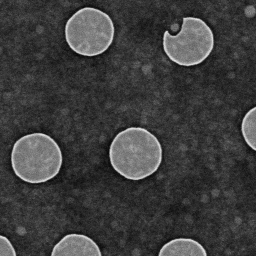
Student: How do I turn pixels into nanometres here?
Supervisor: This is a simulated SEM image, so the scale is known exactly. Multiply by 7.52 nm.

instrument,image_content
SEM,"raised bodies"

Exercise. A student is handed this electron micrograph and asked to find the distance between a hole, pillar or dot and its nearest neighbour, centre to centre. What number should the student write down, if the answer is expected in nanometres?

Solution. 753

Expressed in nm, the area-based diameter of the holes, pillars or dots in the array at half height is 365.